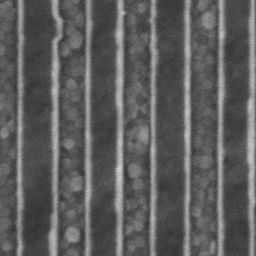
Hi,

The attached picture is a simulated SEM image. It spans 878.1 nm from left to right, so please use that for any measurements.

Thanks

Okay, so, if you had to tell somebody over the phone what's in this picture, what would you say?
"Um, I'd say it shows one or a few lines or trenches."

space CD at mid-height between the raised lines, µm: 0.107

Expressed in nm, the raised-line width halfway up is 119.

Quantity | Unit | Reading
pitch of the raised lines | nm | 227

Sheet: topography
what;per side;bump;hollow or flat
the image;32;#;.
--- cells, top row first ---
...####....####....#####....####
...####....####....#####....####
...#####...####....#####....####
...#####...####....####.....####
...#####...####....####.....####
...####....####....####.....####
...####....####....#####....####
...####....####....#####....####
...####....####....####.....####
...####....####....####.....####
...####....####....####.....####
...####....####....####.....####
...####....####....#####....####
..#####....####....#####....####
..#####....####....#####....####
..#####....####....#####....####
..#####....####....#####....####
..#####....####....#####....####
..#####....####....#####....####
..#####....####....#####....####
..#####....####....#####....####
..#####....####....#####....####
..#####....####....#####....####
..#####....####....#####....####
..#####....####....#####....####
..#####....####....####.....####
..#####....####....####.....####
..#####....####....####.....####
..#####....####....####.....####
..#####....####....####.....####
..#####....####....####.....###.
..#####....####....####.....###.